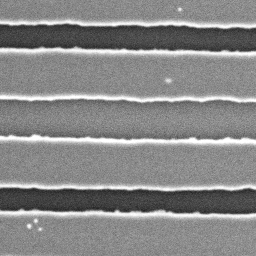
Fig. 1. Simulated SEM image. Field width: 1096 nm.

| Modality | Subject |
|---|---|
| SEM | lines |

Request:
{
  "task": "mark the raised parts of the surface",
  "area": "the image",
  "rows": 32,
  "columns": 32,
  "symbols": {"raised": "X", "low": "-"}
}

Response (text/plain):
XXXXXXXXXXXXXXXXXXXXXXXXXXXXXXXX
XXXXXXXXXXXXXXXXXXXXXXXXXXXXXXXX
XXXXXXXXXXXXXXXXXXXXXXXXXXXXXXXX
--------------------------------
--------------------------------
--------------------------------
XXXXXXXXXXXXXXXXXXXXXXXXXXX----X
XXXXXXXXXXXXXXXXXXXXXXXXXXXXXXXX
XXXXXXXXXXXXXXXXXXXXXXXXXXXXXXXX
XXXXXXXXXXXXXXXXXXXXXXXXXXXXXXXX
XXXXXXXXXXXXXXXXXXXXXXXXXXXXXXXX
XXXXXXXXXXXXXXXXXXXXXXXXXXXXXXXX
---XX-----------XXXXXXXXXX--XXXX
--------------------------------
--------------------------------
--------------------------------
--------------------------------
XXXXXXXXXXXXXXX-----------------
XXXXXXXXXXXXXXXXXXXXXXXXXXXXXXXX
XXXXXXXXXXXXXXXXXXXXXXXXXXXXXXXX
XXXXXXXXXXXXXXXXXXXXXXXXXXXXXXXX
XXXXXXXXXXXXXXXXXXXXXXXXXXXXXXXX
XXXXXXXXXXXXXXXXXXXXXXXXXXXXXXXX
-----XXX-XXXXXXXXXXXXXXXXXXXXXXX
--------------------------------
--------------------------------
XXXXXXX-------------------------
XXXXXXXXXXXXXXXXXXXXXXXXXXXXXXXX
XXXXXXXXXXXXXXXXXXXXXXXXXXXXXXXX
XXXXXXXXXXXXXXXXXXXXXXXXXXXXXXXX
XXXXXXXXXXXXXXXXXXXXXXXXXXXXXXXX
XXXXXXXXXXXXXXXXXXXXXXXXXXXXXXXX